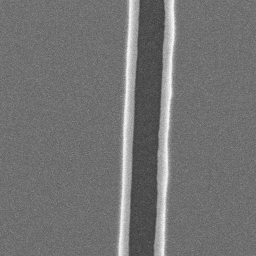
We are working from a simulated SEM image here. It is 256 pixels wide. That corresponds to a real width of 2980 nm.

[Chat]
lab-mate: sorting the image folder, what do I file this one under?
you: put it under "one or a few lines or trenches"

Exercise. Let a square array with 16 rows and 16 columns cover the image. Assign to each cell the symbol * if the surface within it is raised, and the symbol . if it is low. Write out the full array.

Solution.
********...*****
********...*****
********...*****
********...*****
********..******
********..******
********..******
********..******
********..******
********..******
********..******
********..******
********..******
********..******
********..******
********..******